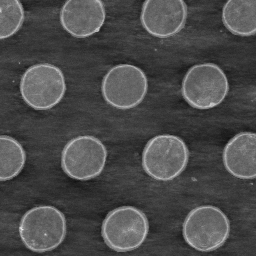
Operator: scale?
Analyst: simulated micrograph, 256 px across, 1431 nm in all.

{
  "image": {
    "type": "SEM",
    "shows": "a regular array of raised bodies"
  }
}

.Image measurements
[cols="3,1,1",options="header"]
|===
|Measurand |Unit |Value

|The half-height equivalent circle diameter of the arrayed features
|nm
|249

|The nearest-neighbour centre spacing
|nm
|453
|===